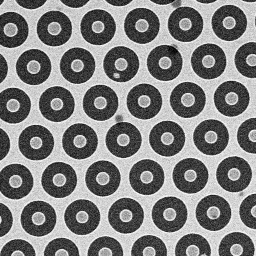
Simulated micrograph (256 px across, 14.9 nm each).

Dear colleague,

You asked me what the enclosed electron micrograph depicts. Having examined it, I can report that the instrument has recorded an array of small figures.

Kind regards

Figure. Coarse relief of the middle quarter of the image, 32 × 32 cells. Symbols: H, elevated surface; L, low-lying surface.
LLHHHLLLHHLLLHHHLLLHHLLLHHLLLLHH
LLHHLLLLHHLLLLHLLLLHHLLLLLLLLHHH
LLLLLLLHHHLLLLLLLLHHHHLLLLLLLHHH
LLLLLLLHHHHLLLLLLHHHHHLLLLLLHHHH
HLLLLLHHHHHHHLLHHHHHHHHHHHHHHHLL
HHHHHHHLLLLHHHHHHHLLLLHHHHHHLLLL
LHHHHHLLLLLLHHHHLLLLLLLLHHHLLLLL
LLHHHLLLLLLLLHHHLLLLLLLLHHHLLLHH
LLHHHLLLHHLLLLHHLLLHHLLLLHLLLHHH
LLLHHLLLHHLLLLHLLLLHHLLLLHLLLHHH
LLLHLLLLHHLLLLHHLLLHHLLLLHHLLLLL
LLLHHLLLLLLLLHHHLLLLLLLLHHHLLLLL
LLHHHLLLLLLLLHHHHLLLLLLHHHHHLLLL
LHHHHHLLLLLLHHHHHHLLLLHHHHHHHHLL
HHHHHHHHHHHHHHLLHHHHHHHHLLLLHHHH
HHLLLLHHHHHHLLLLLLHHHHHLLLLLLHHH
LLLLLLLLHHHLLLLLLLLHHHLLLLLLLLHH
LLLLLLLLHHHLLLLLLLLHHLLLLHHLLLHH
LLLHHLLLHHLLLHHHLLLHHLLLHHHLLLHH
LLLHHLLLLHLLLHHHLLLLHLLLLHHLLLHH
LLLHHLLLHHHLLLLLLLLHHHLLLLLLLLHH
LLLLLLLLHHHLLLLLLLLHHHLLLLLLLHHH
HLLLLLLHHHHHLLLLLLHHHHHLLLLLHHHH
HHLLLLHHHHHHHHLLHHHHHHHHHHHHHHHL
HHHHHHHHLLLLHHHHHHLLLLLHHHHHHLLL
LLHHHHLLLLLLLHHHHLLLLLLLHHHHLLLL
LLLHHHLLLLLLLLHHHLLLLLLLLHHLLLLL
LLLHHLLLLHHLLLHHLLLHHHLLLHHLLLHH
LLLHHLLLHHHLLLHHLLLHHHLLLHHLLLHH
LLLHHLLLHHHLLLHHLLLLHHLLLHHLLLLL
LLLHHHLLLLLLLLHHHLLLLLLLLHHHLLLL
LLLHHHLLLLLLLHHHHLLLLLLLHHHHHLLL